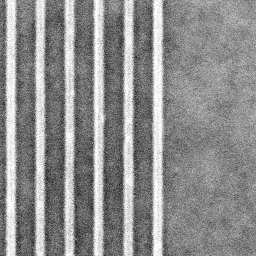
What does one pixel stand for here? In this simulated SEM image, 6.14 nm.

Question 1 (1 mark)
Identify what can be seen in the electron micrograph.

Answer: parallel lines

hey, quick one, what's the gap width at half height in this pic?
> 148 nm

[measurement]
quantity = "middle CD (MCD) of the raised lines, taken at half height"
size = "0.033 um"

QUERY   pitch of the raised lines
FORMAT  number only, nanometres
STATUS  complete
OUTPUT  180